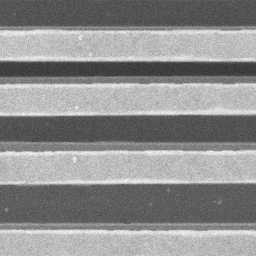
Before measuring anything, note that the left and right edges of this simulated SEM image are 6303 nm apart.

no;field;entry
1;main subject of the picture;lines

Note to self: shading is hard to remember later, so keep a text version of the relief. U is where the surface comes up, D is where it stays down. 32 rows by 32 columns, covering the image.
DDDDDDDDDDDDDDDDDDDDDDDDDDDDDDDD
DDDDDDDDDDDDDDDDDDDDDDDDDDDDDDDD
DDDDDDDDDDDDDDDDDDDDDDDDDDDDDDDD
UUUUUUUUUUUUUUUUUUUUUUUUUUUUUUUU
UUUUUUUUUUUUUUUUUUUUUUUUUUUUUUUU
UUUUUUUUUUUUUUUUUUUUUUUUUUUUUUUU
UUUUUUUUUUUUUUUUUUUUUUUUUUUUUUUU
UUUUUUUUUUUUUUUUUUUUUUUUUUUUUUUU
DDDDDDDDDDDDDDDDDDDDDDDDDDDDDDDD
DDDDDDDDDDDDDDDDDDDDDDDDDDDDDDDD
UUUUUUUUUUUUUUUUUUUUUUUUUUUUUUUU
UUUUUUUUUUUUUUUUUUUUUUUUUUUUUUUU
UUUUUUUUUUUUUUUUUUUUUUUUUUUUUUUU
UUUUUUUUUUUUUUUUUUUUUUUUUUUUUUUU
DDDDDDDDDDDDDDDDDDDDDDDDDDDDDDDD
DDDDDDDDDDDDDDDDDDDDDDDDDDDDDDDD
DDDDDDDDDDDDDDDDDDDDDDDDDDDDDDDD
DDDDDDDDDDDDDDDDDDDDDDDDDDDDDDDD
UUUUUUUUUUUUUUUUUUUUUUUUUUUUUUUU
UUUUUUUUUUUUUUUUUUUUUUUUUUUUUUUU
UUUUUUUUUUUUUUUUUUUUUUUUUUUUUUUU
UUUUUUUUUUUUUUUUUUUUUUUUUUUUUUUU
UUUUUUUUUUUUUUUUUUUUUUUUUUUUUUUU
DDDDDDDDDDDDDDDDDDDDDDDDDDDDDDDD
DDDDDDDDDDDDDDDDDDDDDDDDDDDDDDDD
DDDDDDDDDDDDDDDDDDDDDDDDDDDDDDDD
DDDDDDDDDDDDDDDDDDDDDDDDDDDDDDDD
DDDDDDDDDDDDDDDDDDDDDDDDDDDDDDDD
UUUUUUUUUUUUUUUUUUUUUUUUUUUUUUUU
UUUUUUUUUUUUUUUUUUUUUUUUUUUUUUUU
UUUUUUUUUUUUUUUUUUUUUUUUUUUUUUUU
UUUUUUUUUUUUUUUUUUUUUUUUUUUUUUUU